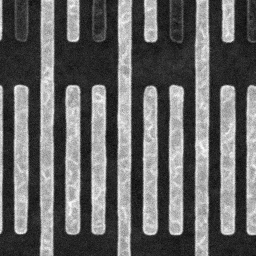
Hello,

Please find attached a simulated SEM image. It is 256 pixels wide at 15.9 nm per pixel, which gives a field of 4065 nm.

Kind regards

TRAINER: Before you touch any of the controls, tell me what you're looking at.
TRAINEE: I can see wiring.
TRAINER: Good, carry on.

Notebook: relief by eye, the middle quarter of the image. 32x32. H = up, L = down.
LLLLLLLLLLLLLLHHHLLLLLLLLLLLLLLL
LLLLLLLLLLLLLLHHHLLLLLLLLLLLLLLL
LLLLLLLLLLLLLLHHHLLLLLLLLLLLLLLL
LLLLLLLLLLLLLLHHLLLLLLLLLLLLLLLL
LLLLLLLLLLLLLLHHLLLLLLLLLLLLLLLL
LLLLLLLLHHLLLLHHLLLLLLLLLLLHLLLL
LHHHLLLHHHLLLLHHLLLLHHHLLLLHHHLL
LHHHLLLHHHLLLLHHLLLLHHHLLLLHHHLL
LHHHLLLHHHLLLLHHLLLLHHHLLLLHHHLL
LHHHLLLHHHLLLLHHLLLLHHHLLLLHHHLL
LHHHLLLHHHLLLLHHLLLLHHHLLLLHHHLL
LHHHLLLHHHLLLLHHLLLLHHHLLLLHHHLL
LHHHLLLHHHLLLLHHLLLLHHHLLLLHHHLL
LHHHLLLHHHLLLLHHLLLLHHHLLLLHHHLL
LHHHLLLHHHLLLLHHLLLLHHHLLLLHHHLL
LHHHLLLHHHLLLLHHLLLLHHHLLLLHHHLL
LHHHLLLHHHLLLLHHLLLLHHHLLLLHHHLL
LHHHLLLHHHLLLLHHLLLLHHHLLLHHHHLL
LHHHLLLHHHLLLLHHLLLLHHHLLLHHHHLL
LHHHLLLHHHLLLLHHLLLLHHHLLLHHHHLL
LHHHLLLHHHLLLLHHLLLLHHHLLLHHHHLL
LHHHLLLHHHLLLLHHLLLLHHHLLLHHHHLL
LHHHLLLHHHLLLLHHLLLLHHHLLLHHHHLL
LHHHLLLHHHLLLLHHLLLLHHHLLLHHHHLL
LHHHLLLHHHLLLLHHLLLLHHHLLLHHHHLL
LHHHLLLHHHLLLLHHLLLLHHHLLLHHHHLL
LHHHLLLHHHLLLLHHLLLLHHHLLLHHHHLL
LHHHLLLHHHLLLLHHLLLLHHHLLLLHHHLL
LHHHLLLHHHLLLLHHLLLLHHHLLLLHHHLL
LHHHLLLHHHLLLLHHLLLLHHHLLLLHHHLL
LHHHLLLHHHLLLLHHLLLLHHHLLLLHHHLL
LHHHLLLHHHLLLLHHLLLLHHHLLLLHHHLL